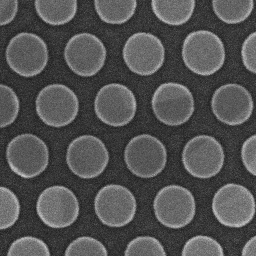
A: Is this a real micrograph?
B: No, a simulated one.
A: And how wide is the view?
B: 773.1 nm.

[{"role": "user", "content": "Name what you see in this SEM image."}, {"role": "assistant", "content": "a regular array of raised bodies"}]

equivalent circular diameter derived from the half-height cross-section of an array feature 126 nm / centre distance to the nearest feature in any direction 0.174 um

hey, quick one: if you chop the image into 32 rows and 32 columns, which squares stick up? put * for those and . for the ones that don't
**...****...*****..*****...*****
**...****...*****..*****...****.
*.....***....***....***.....**..
................................
..**......**.....**.....***....*
.****...*****...****...*****...*
.*****..*****..*****...*****..**
.*****..*****...****...*****..**
..***....****...****....***....*
................................
.....................*..........
**...****...****....****...****.
**...*****..*****..*****...****.
**...*****..*****..*****...****.
**...****...*****...****...****.
*.....**......**.....*.......*..
................................
..***....***.....***....***....*
.*****...****...****...*****..**
.*****..*****...*****..*****..**
.*****..*****...*****..*****...*
..***....****....***....***....*
................................
......**.....***.....**.....***.
**...****...*****...****...****.
**...*****..*****..*****...*****
**...*****..*****..*****...*****
**...****....***....****...****.
*...............................
................................
..***....****...****...****....*
.*****..*****...****...*****..**